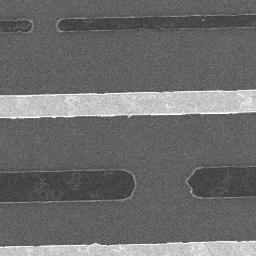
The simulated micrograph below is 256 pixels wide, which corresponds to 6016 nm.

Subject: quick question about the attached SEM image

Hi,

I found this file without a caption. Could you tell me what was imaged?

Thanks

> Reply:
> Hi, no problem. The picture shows one or a few lines or trenches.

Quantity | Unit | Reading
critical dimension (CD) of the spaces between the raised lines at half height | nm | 1280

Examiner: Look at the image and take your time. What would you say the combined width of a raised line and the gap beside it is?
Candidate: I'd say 1890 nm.